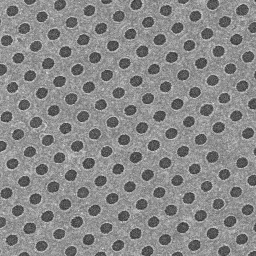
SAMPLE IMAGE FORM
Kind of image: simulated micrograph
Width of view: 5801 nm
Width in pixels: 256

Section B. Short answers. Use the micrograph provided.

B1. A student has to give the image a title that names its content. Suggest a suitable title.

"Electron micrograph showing a regular array of holes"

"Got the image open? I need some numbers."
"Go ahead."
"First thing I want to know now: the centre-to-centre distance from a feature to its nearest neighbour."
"21 pixels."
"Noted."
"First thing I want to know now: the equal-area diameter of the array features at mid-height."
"0.275 um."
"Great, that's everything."